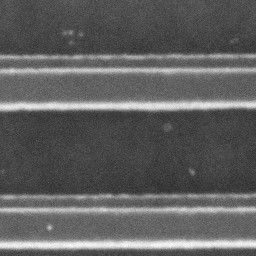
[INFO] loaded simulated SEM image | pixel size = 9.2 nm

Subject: lines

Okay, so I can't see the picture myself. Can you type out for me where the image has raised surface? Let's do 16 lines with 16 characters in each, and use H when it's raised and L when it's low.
LLLLLLLLLLLLLLLL
LLLLLLLLLLLLLLLL
LLLLLLLLLLLLLLLL
LLLLLLLLLLLLLHHH
HHHHHHHHHHHHHHHH
HHHHHHHHHHHHHHHH
HHHHHHHHHHHHHHHH
LLLLLLLLLLLLLLLL
LLLLLLLLLLLLLLLL
LLLLLLLLLLLLLLLL
LLLLLLLLLLLLLLLL
LLLLLLLLLLLLLLLL
HHHHHHHHHHHHHHHH
HHHHHHHHHHHHHHHH
HHHHHHHHHHHHHHHH
LLLLLLLLLLLLLLLL